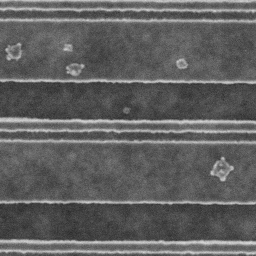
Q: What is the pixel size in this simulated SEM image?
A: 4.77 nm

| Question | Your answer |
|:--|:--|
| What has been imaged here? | lines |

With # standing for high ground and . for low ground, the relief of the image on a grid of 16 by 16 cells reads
################
################
################
################
################
................
................
................
################
################
################
################
################
................
................
################